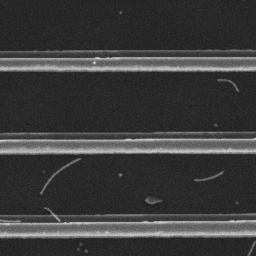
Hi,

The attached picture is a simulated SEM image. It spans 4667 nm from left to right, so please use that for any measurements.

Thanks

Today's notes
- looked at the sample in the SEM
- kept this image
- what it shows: lines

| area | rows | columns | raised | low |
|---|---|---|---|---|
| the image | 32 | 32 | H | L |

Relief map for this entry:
LLLLLLLLLLLLLLLLLLLLLLLLLLLLLLLL
LLLLLLLLLLLLLLLLLLLLLLLLLLLLLLLL
LLLLLLLLLLLLLLLLLLLLLLLLLLLLLLLL
LLLLLLLLLLLLLLLLLLLLLLLLLLLLLLLL
LLLLLLLLLLLLLLLLLLLLLLLLLLLLLLLL
LLLLLLLLLLLLLLLLLLLLLLLLLLLLLLLL
HHHHHHHHHHHHHHHHHHHHHHHHHHHHHHHH
HHHHHHHHHHHHHHHHHHHHHHHHHHHHHHHH
HHHHHHHHHHHHHHHHHHHHHHHHHHHHHHHH
LLLLLLLLLLLLLLLLLLLLLLLLLLLLLLLL
LLLLLLLLLLLLLLLLLLLLLLLLLLLLLLLL
LLLLLLLLLLLLLLLLLLLLLLLLLLLLLLLL
LLLLLLLLLLLLLLLLLLLLLLLLLLLLLLLL
LLLLLLLLLLLLLLLLLLLLLLLLLLLLLLLL
LLLLLLLLLLLLLLLLLLLLLLLLLLLLLLLL
LLLLLLLLLLLLLLLLLLLLLLLLLLLLLLLL
LLLLLLLLLLLLLLLLLLLLLLLLLLLLLLLL
HHHHHHHHHHHHHHHHHHHHHHHHHHHHHHHH
HHHHHHHHHHHHHHHHHHHHHHHHHHHHHHHH
LLLLLLLLLLLLLLLLLLLLLLLLLLLLLLLL
LLLLLLLLLLLLLLLLLLLLLLLLLLLLLLLL
LLLLLLLLLLLLLLLLLLLLLLLLLLLLLLLL
LLLLLLLLLLLLLLLLLLLLLLLLLLLLLLLL
LLLLLLLLLLLLLLLLLLLLLLLLLLLLLLLL
LLLLLLLLLLLLLLLLLLLLLLLLLLLLLLLL
LLLLLLLLLLLLLLLLLLLLLLLLLLLLLLLL
LLLLLLLLLLLLLLLLLLLLLLLLLLLLLLLL
HHHHHHHHHHHHHHHHHHHHHHHHHHHHHHHH
HHHHHHHHHHHHHHHHHHHHHHHHHHHHHHHH
HHHHLLLLLLLLLLLLLLLLLLLLLLLLLLLL
LLLLLLLLLLLLLLLLLLLLLLLLLLLLLLLL
LLLLLLLLLLLLLLLLLLLLLLLLLLLLLLLL